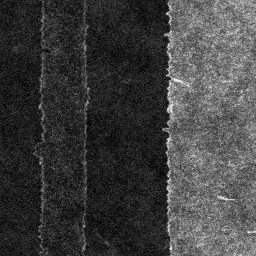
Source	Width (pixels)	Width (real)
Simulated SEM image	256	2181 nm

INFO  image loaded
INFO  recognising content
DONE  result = one or a few lines or trenches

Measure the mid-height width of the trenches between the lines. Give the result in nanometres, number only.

708